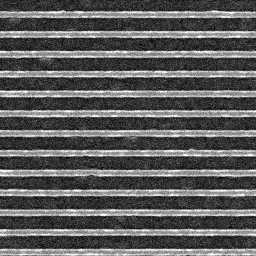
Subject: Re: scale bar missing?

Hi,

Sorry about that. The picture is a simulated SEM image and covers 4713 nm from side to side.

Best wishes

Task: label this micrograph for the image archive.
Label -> parallel lines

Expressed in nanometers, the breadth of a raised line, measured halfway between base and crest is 99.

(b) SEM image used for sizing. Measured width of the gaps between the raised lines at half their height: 260 nanometers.